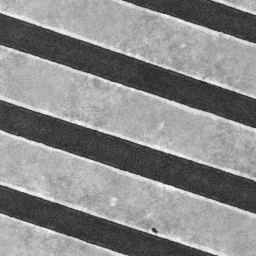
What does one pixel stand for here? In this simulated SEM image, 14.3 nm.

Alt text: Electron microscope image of lines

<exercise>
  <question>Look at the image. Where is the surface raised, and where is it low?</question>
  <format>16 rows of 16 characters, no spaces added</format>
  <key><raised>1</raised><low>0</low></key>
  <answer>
1111111110000001
0011111111110000
0000011111111110
1100000011111111
1111100000011111
1111111100000011
0111111111100000
0000111111111100
1000000111111111
1111000000111111
1111111000000011
1111111111000000
0001111111111000
0000001111111111
1110000001111111
1111110000001111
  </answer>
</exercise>